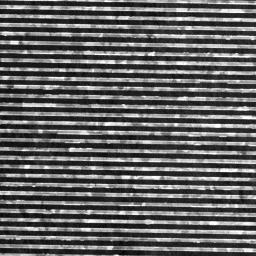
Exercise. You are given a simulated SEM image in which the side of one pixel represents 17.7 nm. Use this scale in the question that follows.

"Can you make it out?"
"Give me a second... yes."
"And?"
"parallel lines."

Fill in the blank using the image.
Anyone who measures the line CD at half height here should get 48.6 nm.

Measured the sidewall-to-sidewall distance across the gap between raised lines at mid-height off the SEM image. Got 106 nanometres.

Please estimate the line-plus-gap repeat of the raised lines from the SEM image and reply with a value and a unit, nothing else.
156 nanometers